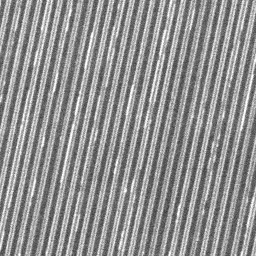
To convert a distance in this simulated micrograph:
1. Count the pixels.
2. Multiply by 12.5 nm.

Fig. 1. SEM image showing parallel lines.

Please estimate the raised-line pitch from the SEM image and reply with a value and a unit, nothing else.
126 nm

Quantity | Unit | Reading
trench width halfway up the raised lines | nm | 73.5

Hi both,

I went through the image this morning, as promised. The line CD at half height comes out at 3.91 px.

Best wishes